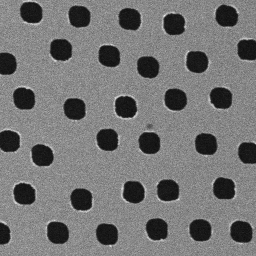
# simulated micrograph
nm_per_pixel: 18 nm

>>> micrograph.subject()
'a regular array of holes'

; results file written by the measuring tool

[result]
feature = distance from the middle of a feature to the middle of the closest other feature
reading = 757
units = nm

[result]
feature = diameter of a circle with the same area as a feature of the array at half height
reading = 413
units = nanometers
